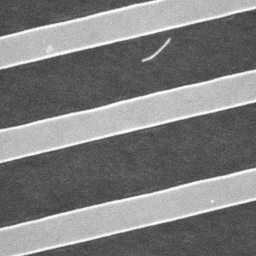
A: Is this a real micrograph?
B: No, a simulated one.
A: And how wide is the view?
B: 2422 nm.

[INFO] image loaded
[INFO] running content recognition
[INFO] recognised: lines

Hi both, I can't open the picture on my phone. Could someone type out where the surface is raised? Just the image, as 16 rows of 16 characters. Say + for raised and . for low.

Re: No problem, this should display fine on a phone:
........++++++++
...+++++++++....
++++++++........
+++.............
...............+
...........+++++
.......++++++++.
...++++++++.....
+++++++.........
+++.............
................
............++++
.......+++++++++
...+++++++++....
++++++++........
+++.............